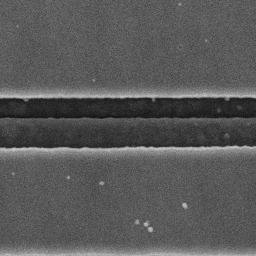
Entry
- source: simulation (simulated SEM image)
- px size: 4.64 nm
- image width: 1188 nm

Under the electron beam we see lines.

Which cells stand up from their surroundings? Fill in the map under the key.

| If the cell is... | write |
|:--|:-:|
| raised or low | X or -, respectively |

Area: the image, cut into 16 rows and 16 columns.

XXXXXXXXXXXXXXXX
XXXXXXXXXXXXXXXX
XXXXXXXXXXXXXXXX
XXXXXXXXXXXXXXXX
XXXXXXXXXXXXXXXX
XXXXXXXXXXXXXXXX
----------------
----------------
----------------
XXXXXXXXXXXXXXXX
XXXXXXXXXXXXXXXX
XXXXXXXXXXXXXXXX
XXXXXXXXXXXXXXXX
XXXXXXXXXXXXXXXX
XXXXXXXXXXXXXXXX
XXXXXXXXXXXXXXXX